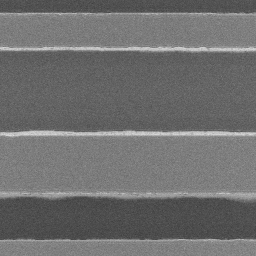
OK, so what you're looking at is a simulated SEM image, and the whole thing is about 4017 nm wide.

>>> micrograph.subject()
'lines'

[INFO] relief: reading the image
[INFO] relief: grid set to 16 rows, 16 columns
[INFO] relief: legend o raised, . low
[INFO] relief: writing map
................
oooooooooooooooo
oooooooooooooooo
................
................
................
................
................
oooooooooooooooo
oooooooooooooooo
oooooooooooooooo
oooooooooooooooo
................
................
................
oooooooooooooooo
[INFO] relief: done